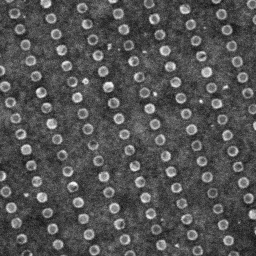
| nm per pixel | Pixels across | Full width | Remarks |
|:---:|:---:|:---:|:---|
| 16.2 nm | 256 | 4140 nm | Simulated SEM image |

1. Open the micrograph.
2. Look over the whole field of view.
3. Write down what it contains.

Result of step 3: a regular array of raised bodies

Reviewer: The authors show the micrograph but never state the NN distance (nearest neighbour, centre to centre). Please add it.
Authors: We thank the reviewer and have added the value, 267 nanometers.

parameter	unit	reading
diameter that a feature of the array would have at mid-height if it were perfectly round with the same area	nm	145